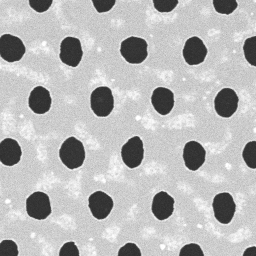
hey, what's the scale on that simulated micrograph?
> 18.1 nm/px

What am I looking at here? a regular array of holes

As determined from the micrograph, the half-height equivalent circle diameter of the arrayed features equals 26.9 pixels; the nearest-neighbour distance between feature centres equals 58.8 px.